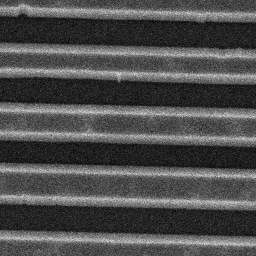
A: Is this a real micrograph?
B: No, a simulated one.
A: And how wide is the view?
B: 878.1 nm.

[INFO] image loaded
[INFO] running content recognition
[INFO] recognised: one or a few lines or trenches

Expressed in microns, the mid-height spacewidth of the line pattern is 0.112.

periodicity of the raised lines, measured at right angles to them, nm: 211